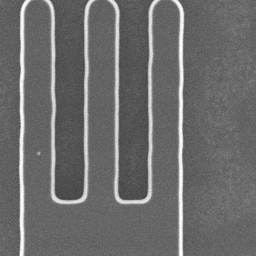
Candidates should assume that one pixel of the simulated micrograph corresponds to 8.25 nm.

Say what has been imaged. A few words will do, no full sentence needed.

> groups of lines, slits or small figures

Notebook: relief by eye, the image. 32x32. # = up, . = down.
...###.....###.....###..........
...####....####....####.........
...####....####....####.........
...####....####....####.........
...####....####....####.........
...####....####....####.........
...####....####....####.........
...####....####....####.........
...####....####....####.........
...####....####....####.........
...####....####....####.........
...####....####....####.........
...####....####....####.........
...####....####....####.........
...####....####....####.........
...####....####....####.........
...####....####....####.........
...####....####....####.........
...####....####....####.........
...####....####....####.........
...####....####....####.........
...####....####....####.........
...####....####....####.........
...####....####....####.........
...####....####....####.........
...####################.........
...####################.........
...####################.........
...####################.........
...####################.........
...####################.........
...####################.........